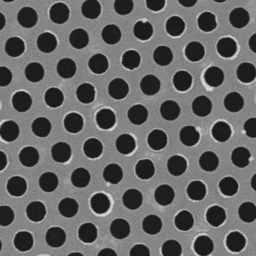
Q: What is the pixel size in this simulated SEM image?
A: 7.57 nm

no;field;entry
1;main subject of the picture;a regular array of holes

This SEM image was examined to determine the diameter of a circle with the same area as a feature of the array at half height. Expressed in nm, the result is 153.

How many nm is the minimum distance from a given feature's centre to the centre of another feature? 241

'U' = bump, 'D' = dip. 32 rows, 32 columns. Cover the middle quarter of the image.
DDDUUUDDDDDUUUUDDDDUUUUUUUUUUUUU
DDDUUUUDDDDUUUUUUUUUUUUUUUUUUUUU
DDDUUUUUDUUUUUUUUUUUUUUUUUUUDDDU
DDUUUUUUUUUUUDUUUUUUDDDUUUUDDDDD
UUUUUUUUUUUUDDDDUUUDDDDDUUUDDDDD
UUUUDDDUUUUDDDDDUUUDDDDDUUUDDDDD
UUUDDDDDUUUDDDDDUUUDDDDDUUUUDDDU
UUUDDDDDUUUDDDDDUUUUDDDUUUUUUUUU
UUUDDDDDUUUUDDDUUUUUUUUUUUUUUUUU
UUUUDDDUUUUUUUUUUUUUUUUUUDDDUUUU
UUUUUUUUUUUUUUUUUDDDUUUUDDDDDUUU
UUUUUUUUUDDDUUUUDDDDDUUUDDDDDUUU
UDDDUUUUDDDDDUUUDDDDDUUUDDDDDUUU
DDDDDUUUDDDDDUUUDDDDDUUUUDDDUUUU
DDDDDUUUDDDDDUUUUDDDUUUUUUUUUUUU
DDDDDUUUUDDDUUUUUUUUUUUUUUUUUUUD
UDDDUUUUUUUUUUUUUUUUUUDDUUUUUDDD
UUUUUUUUUUUUUUUDUUUUUDDDDDUUUDDD
UUUUUUUUUUUUUDDDDUUUUDDDDDUUUDDD
UUUUUDDDDUUUUDDDDDUUUDDDDDUUUDDD
DUUUUDDDDDUUUDDDDDUUUDDDDUUUUUUD
DDUUUDDDDDUUUDDDDUUUUUUUUUUUUUUU
DDUUUDDDDUUUUUUDUUUUUUUUUUUUUUUU
DUUUUUUDUUUUUUUUUUUUUUUUUUUDDDUU
UUUUUUUUUUUUUUUUUUUDDDUUUUDDDDDU
UUUUUUUUUUUDDDUUUUDDDDDUUUDDDDDU
UUUDDDUUUUDDDDUUUUDDDDDUUUDDDDUU
UUDDDDUUUUDDDDDUUUDDDDDUUUUDDDUU
UUDDDDDUUUDDDDDUUUUDDDUUUUUUUUUU
UUDDDDUUUUUDDDUUUUUUUUUUUUUUUUUU
UUUDDDUUUUUUUUUUUUUUUUUUDDUUUUUD
UUUUUUUUUUUUUUUUDDUUUUUDDDDUUUUD